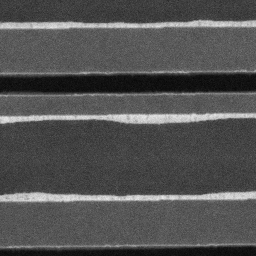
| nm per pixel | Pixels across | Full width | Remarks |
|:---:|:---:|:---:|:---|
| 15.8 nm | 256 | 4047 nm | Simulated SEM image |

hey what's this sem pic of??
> lines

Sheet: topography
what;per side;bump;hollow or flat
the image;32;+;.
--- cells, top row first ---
................................
................................
................................
++++++++++++++++++++++++++++++++
++++++++++++++++++++++++++++++++
++++++++++++++++++++++++++++++++
++++++++++++++++++++++++++++++++
++++++++++++++++++++++++++++++++
++++++++++++++++++++++++++++++++
................................
................................
................................
++++++++++++++++++++++++++++++++
++++++++++++++++++++++++++++++++
+++++++++++++++++++++++++++.....
................................
................................
................................
................................
................................
................................
................................
................................
................................
...............................+
++++++++++++++++++++++++++++++++
++++++++++++++++++++++++++++++++
++++++++++++++++++++++++++++++++
++++++++++++++++++++++++++++++++
++++++++++++++++++++++++++++++++
++++++++++++++++++++++++++++++++
................................